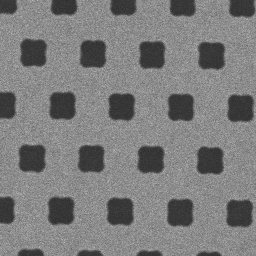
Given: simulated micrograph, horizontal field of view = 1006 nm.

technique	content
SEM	a regular array of holes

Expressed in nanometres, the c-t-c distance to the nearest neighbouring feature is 233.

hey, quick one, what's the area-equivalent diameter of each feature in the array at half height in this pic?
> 112 nm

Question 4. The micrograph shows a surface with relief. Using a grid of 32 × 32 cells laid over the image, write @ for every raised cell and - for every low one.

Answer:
--@@@@----@@@@---@@@@---@@@@@---
--@@@@@--@@@@@---@@@@---@@@@@---
@@@@@@@@@@@@@@@@@@@@@@@@@@@@@@@@
@@@@@@@@@@@@@@@@@@@@@@@@@@@@@@@@
@@@@@@@@@@@@@@@@@@@@@@@@@@@@@@@@
@@@---@@@@---@@@@@--@@@@@---@@@@
@@@---@@@@---@@@@----@@@@---@@@@
@@@---@@@@---@@@@----@@@@---@@@@
@@@@@@@@@@@@@@@@@@--@@@@@---@@@@
@@@@@@@@@@@@@@@@@@@@@@@@@@@@@@@@
@@@@@@@@@@@@@@@@@@@@@@@@@@@@@@@@
@@@@@@@@@@@@@@@@@@@@@@@@@@@@@@@@
--@@@@---@@@@@---@@@@---@@@@@---
--@@@@---@@@@@---@@@@---@@@@@---
--@@@@---@@@@@---@@@@---@@@@----
@@@@@@@@@@@@@@@@@@@@@@@@@@@@@@@@
@@@@@@@@@@@@@@@@@@@@@@@@@@@@@@@@
@@@@@@@@@@@@@@@@@@@@@@@@@@@@@@@@
@@@--@@@@@---@@@@@--@@@@@--@@@@@
@@----@@@@---@@@@---@@@@@---@@@@
@@----@@@@---@@@@---@@@@@---@@@@
@@@@@@@@@@@@@@@@@@--@@@@@---@@@@
@@@@@@@@@@@@@@@@@@@@@@@@@@@@@@@@
@@@@@@@@@@@@@@@@@@@@@@@@@@@@@@@@
@@@@@@@@@@@@@@@@@@@@@@@@@@@@@@@@
--@@@@---@@@@----@@@@---@@@@---@
--@@@@---@@@@----@@@@---@@@@----
--@@@@---@@@@----@@@@---@@@@----
@@@@@@@@@@@@@@@@@@@@@@@@@@@@@@@@
@@@@@@@@@@@@@@@@@@@@@@@@@@@@@@@@
@@@@@@@@@@@@@@@@@@@@@@@@@@@@@@@@
@@---@@@@@--@@@@@@--@@@@@@@@@@@@